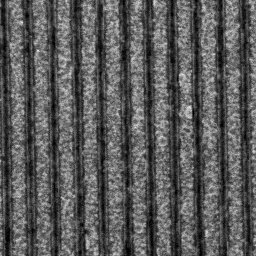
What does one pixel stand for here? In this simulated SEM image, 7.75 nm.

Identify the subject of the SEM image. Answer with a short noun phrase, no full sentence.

parallel lines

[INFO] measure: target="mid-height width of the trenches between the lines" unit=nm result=134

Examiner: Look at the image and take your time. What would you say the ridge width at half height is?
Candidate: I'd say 49.4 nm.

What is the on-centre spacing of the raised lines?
0.186 um